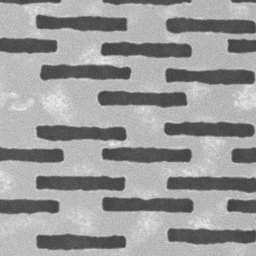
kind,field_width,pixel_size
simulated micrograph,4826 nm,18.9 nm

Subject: a regular array of holes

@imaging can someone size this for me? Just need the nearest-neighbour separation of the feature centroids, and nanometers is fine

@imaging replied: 940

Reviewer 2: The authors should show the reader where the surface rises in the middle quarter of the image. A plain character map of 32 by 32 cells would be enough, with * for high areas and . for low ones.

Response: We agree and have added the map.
............********************
.................********.....**
.................********.......
.................********.......
**************************......
********************************
********************************
********......................**
********.......................*
*********......................*
**********......***.**........**
********************************
********************************
********************************
******************************..
..***********************.......
...............**********.......
................*********.......
................****************
********************************
********************************
**********......................
*********.......................
**********......................
*****************.......**.....*
********************************
********************************
********************************
...............***********......
................**********......
...............***********......
...............************..**.